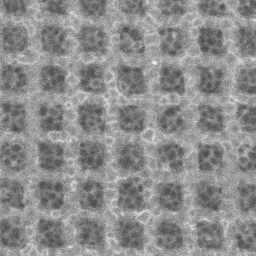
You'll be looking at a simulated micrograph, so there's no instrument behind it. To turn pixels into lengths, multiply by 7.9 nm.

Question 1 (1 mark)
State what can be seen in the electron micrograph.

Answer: a regular array of raised bodies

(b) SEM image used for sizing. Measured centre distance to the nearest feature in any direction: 0.304 micrometres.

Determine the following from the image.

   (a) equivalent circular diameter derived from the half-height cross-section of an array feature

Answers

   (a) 221 nm